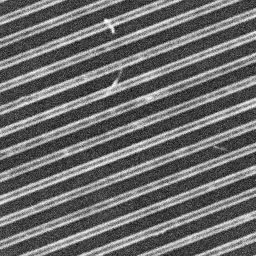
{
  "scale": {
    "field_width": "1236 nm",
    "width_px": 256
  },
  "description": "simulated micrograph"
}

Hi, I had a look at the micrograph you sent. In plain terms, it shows parallel lines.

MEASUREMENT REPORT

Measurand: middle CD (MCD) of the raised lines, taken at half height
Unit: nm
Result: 33.2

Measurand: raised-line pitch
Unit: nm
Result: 101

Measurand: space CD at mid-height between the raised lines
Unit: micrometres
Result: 0.0665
